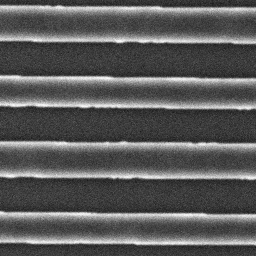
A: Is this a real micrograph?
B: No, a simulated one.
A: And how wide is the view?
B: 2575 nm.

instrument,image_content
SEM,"lines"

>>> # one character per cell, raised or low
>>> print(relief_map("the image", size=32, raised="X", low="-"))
--------------------------------
XXXXXXXXXXXXXXXXXXXXXXXXXXXXXXXX
XXXXXXXXXXXXXXXXXXXXXXXXXXXXXXXX
XXXXXXXXXXXXXXXXXXXXXXXXXXXXXXXX
XXXXXXXXXXXXXXXXXXXXXXXXXXXXXXXX
--------------------------------
--------------------------------
--------------------------------
--------------------------------
--------------------------------
XXXXXXXXXXXXXXXXXXXXXXXXXXXXXXXX
XXXXXXXXXXXXXXXXXXXXXXXXXXXXXXXX
XXXXXXXXXXXXXXXXXXXXXXXXXXXXXXXX
-----------------------------XXX
--------------------------------
--------------------------------
--------------------------------
--------------------------------
XXXXXXXXXXXXXXXXXXXXXXXXXXXXXXXX
XXXXXXXXXXXXXXXXXXXXXXXXXXXXXXXX
XXXXXXXXXXXXXXXXXXXXXXXXXXXXXXXX
XXXXXXXXXXXXXXXXXXXXXXXXXXXXXXXX
--------------------------------
--------------------------------
--------------------------------
--------------------------------
--------------------------------
XXXXXXXXXXXXXXXXXXXXXXXXXXXXXXXX
XXXXXXXXXXXXXXXXXXXXXXXXXXXXXXXX
XXXXXXXXXXXXXXXXXXXXXXXXXXXXXXXX
--------------------------------
--------------------------------